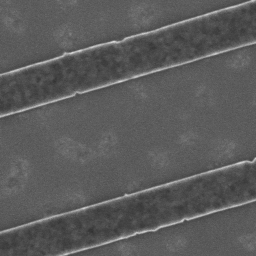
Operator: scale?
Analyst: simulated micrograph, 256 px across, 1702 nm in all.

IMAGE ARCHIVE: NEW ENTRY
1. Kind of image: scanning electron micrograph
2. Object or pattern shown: one or a few lines or trenches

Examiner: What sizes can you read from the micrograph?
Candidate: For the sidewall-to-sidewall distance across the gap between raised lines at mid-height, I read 735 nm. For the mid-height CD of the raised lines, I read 273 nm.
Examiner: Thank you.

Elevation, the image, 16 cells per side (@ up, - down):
--------------@@
-----------@@@@@
--------@@@@@@@@
----@@@@@@@@@---
-@@@@@@@@@------
@@@@@@----------
@@@-------------
----------------
----------------
----------------
--------------@@
----------@@@@@@
-------@@@@@@@@@
----@@@@@@@@@---
@@@@@@@@@-------
@@@@@@----------